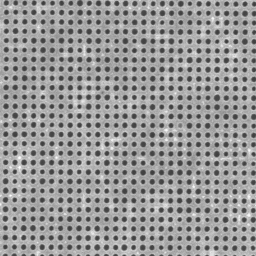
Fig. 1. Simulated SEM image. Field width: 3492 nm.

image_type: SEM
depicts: a regular array of holes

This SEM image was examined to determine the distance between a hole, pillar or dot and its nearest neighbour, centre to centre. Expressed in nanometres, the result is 120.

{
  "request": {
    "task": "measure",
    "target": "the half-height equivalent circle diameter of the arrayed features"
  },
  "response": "70.5 nm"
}